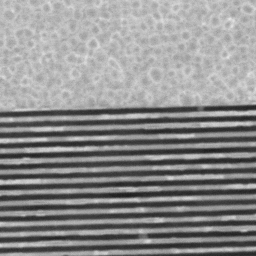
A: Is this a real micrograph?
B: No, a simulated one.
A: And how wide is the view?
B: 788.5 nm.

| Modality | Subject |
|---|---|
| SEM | parallel lines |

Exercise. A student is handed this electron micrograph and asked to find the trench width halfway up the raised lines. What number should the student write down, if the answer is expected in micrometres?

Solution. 0.0181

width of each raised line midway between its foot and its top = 0.015 micrometres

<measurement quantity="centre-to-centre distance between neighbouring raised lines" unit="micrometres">0.0322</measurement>